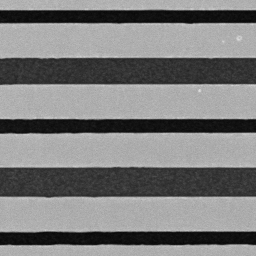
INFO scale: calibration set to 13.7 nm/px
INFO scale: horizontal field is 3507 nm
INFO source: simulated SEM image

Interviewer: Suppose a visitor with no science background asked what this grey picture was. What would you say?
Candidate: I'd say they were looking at lines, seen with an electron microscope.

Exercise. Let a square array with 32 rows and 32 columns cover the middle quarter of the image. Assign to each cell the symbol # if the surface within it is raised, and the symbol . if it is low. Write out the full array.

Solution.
................................
................................
................................
................................
................................
################################
################################
################################
################################
################################
################################
################################
################################
################################
................................
................................
................................
################################
################################
################################
################################
################################
################################
################################
################################
################################
................................
................................
................................
................................
................................
................................